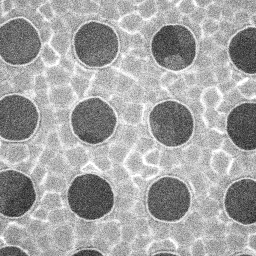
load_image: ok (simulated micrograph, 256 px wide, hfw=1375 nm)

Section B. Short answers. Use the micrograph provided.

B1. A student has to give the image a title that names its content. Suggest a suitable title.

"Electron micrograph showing raised bodies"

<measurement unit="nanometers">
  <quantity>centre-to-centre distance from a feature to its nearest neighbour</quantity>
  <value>409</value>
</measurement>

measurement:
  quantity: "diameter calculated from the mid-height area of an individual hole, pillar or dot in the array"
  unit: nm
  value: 254